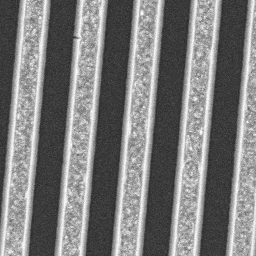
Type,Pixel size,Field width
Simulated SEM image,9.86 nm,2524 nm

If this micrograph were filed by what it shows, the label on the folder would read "parallel lines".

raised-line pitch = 56.8 pixels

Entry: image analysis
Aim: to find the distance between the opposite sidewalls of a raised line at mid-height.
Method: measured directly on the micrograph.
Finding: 25.9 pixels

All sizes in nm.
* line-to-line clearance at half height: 306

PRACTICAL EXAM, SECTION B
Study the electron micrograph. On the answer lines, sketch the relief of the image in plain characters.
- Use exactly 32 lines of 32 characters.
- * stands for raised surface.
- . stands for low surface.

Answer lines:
...***....***....***....***....*
...***....***....***....***....*
...***....***....***....***....*
..****....***....***....***....*
..****....***....***....***....*
..***....****....***....***....*
..***....****...****....***....*
..***....****...****....***....*
..***....***....****...****....*
..***....***....***....****....*
..***....***....***....***....**
..***....***....***....***....**
..***....***....***....***....**
..***....***....***....***....**
..***....***....***....***....**
.****....***....***....***....**
.****...****....***....***....**
.****...****....***....***....**
.***....****...****....***....**
.***....***....****...****....**
.***....***....***....****....**
.***....***....***....****...***
.***....***....***....***....***
.***....***....***....***....***
.***....***....***....***....***
.***....***....***....***....***
****....***....***....***....***
****....***....***....***....***
****...****....***....***....***
***....****...****....***....***
***....****...****....***....***
***....***....***....****....***